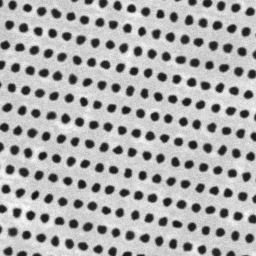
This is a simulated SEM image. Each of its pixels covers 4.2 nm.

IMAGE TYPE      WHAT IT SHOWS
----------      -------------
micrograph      a regular array of holes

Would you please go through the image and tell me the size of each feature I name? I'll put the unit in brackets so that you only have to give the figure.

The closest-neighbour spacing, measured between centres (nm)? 60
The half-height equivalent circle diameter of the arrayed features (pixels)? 8.88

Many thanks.